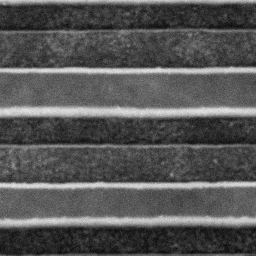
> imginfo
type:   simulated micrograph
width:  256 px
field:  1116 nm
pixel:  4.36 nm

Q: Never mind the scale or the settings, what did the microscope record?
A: lines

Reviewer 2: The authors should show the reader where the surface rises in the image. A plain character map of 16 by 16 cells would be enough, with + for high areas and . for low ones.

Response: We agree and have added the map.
................
................
................
................
++++++++++++++++
++++++++++++++++
++++++++++++++++
................
................
................
................
.....+++++++++++
++++++++++++++++
++++++++++++++++
................
................